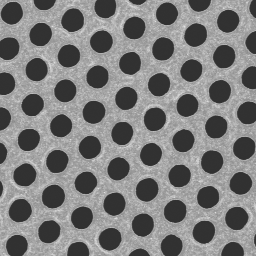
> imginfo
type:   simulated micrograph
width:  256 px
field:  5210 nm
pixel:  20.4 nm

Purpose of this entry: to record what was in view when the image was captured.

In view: a regular array of holes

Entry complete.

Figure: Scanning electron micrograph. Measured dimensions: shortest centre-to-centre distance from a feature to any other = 0.716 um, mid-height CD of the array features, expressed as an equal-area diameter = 459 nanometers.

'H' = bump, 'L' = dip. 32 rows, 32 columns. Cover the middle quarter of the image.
LLLHHHHHLHHHHHLLLLLHHHHHHHHHHLLL
HHHHHHLLLLLHHHLLLLLHHHHHHHHHHLLL
HHHHHHLLLLLHHHHHLLHHHHHLLHHHHLLL
HHHHHHLLLLLHHHHHHHHHHHLLLLHHHHLL
LLHHHHLLLLLHHHHHHHHHHLLLLLLHHHHL
LLLHHHHLLLHHHHHHHHHHHLLLLLHHHHHH
LLLHHHHHHHHHHHLLLLHHHLLLLLHHHHHH
LLLHHHHHHHHHHLLLLLHHHHLLLHHHHHLH
LLHHHHHHHHHHHLLLLLLHHHHHHHHHHLLL
LHHHHHLLLHHHHLLLLLHHHHHHHHHHLLLL
HHHHHLLLLLHHHLLLLLHHHHHHHHHHLLLL
HHHHHLLLLLHHHHHLHHHHHLLLLHHHLLLL
HHHHHLLLLLHHHHHHHHHHLLLLLHHHHLLL
LHHHHLLLLLHHHHHHHHHHLLLLLLHHHHHH
LLHHHHLLLHHHHHHHHHHHLLLLLHHHHHHH
LLHHHHHHHHHHHLLLLHHHLLLLLHHHHHHH
LLHHHHHHHHHHLLLLLHHHHLLLHHHHHLLH
LHHHHHHHHHHHLLLLLHHHHHHHHHHHLLLL
HHHHHLLLHHHHLLLLLHHHHHHHHHHLLLLL
HHHHLLLLLHHHHLLLHHHHHHHHHHHLLLLL
HHHHLLLLLHHHHHHHHHHHLLLLHHHLLLLL
HHHHLLLLLHHHHHHHHHHLLLLLHHHHLLLH
LHHHLLLLLHHHHHHHHHHLLLLLLHHHHHHH
LHHHHLLLHHHHHLHHHHHLLLLLHHHHHHHH
LHHHHHHHHHHHLLLLHHHHLLLLHHHHHHHH
LHHHHHHHHHHLLLLLHHHHHHHHHHHHLLHH
HHHHHHHHHHHLLLLLHHHHHHHHHHHLLLLH
HHHHLLLHHHHLLLLLHHHHHHHHHHLLLLLL
HHHLLLLLHHHHLLLHHHHHHLHHHHLLLLLL
HHHLLLLLHHHHHHHHHHHLLLLHHHLLLLLH
HHHLLLLLHHHHHHHHHHLLLLLLHHHLLLHH
HHHLLLLHHHHHHHHHHHLLLLLLHHHHHHHH